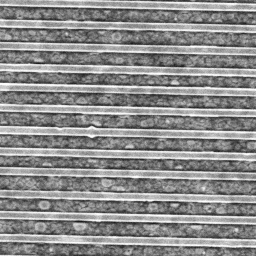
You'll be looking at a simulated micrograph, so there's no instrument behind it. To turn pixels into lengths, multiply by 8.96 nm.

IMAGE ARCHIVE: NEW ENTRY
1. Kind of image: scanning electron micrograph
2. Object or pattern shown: parallel lines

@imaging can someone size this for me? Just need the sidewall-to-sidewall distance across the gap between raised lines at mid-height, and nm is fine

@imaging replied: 132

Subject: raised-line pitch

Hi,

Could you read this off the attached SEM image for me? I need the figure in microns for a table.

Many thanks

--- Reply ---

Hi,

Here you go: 0.192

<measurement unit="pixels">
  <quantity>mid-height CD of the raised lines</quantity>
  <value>6.75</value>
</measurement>